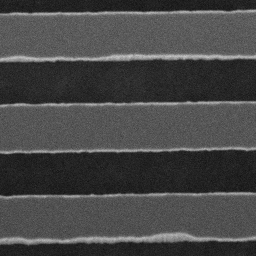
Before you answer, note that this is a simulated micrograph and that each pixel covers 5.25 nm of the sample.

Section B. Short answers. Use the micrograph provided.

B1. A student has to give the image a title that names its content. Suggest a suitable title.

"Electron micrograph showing lines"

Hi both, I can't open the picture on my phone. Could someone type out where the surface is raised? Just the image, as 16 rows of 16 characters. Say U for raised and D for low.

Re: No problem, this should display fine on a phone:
DDDDDDDDDDDDDDDD
UUUUUUUUUUUUUUUU
UUUUUUUUUUUUUUUU
UUUUUUUUUUUUUUUU
DDDDDDDDDDDDDDDD
DDDDDDDDDDDDDDDD
DUUUUUUUUUUUUUUU
UUUUUUUUUUUUUUUU
UUUUUUUUUUUUUUUU
UUUUUUDUDDDDDDDD
DDDDDDDDDDDDDDDD
DDDDDDDDDDDDDDDD
UUUUUUUUUUUUUUUU
UUUUUUUUUUUUUUUU
UUUUUUUUUUUUUUUU
DDDDDDDDDDDDDDDD